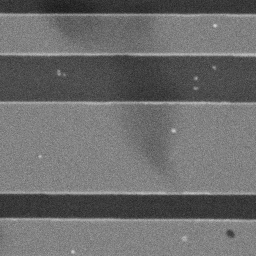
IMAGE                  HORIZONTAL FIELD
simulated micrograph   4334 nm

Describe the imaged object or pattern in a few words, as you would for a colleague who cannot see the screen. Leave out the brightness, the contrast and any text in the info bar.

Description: lines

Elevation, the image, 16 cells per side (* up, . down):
................
****************
****************
................
................
................
****************
****************
****************
****************
****************
****************
................
................
****************
****************